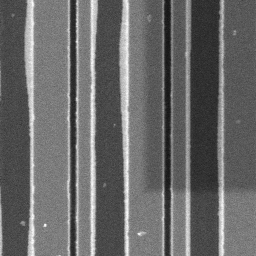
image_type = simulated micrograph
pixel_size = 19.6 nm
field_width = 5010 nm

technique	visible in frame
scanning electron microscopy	lines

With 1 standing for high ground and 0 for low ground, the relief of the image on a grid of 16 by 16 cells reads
0011110011110011
0011110011110011
0011110011110011
0011110011110011
0011110011110011
0011110011110011
0011110011110011
0011110011110011
0011110011110011
0011110011110011
0011110011110011
0011110011110011
0011110011110011
0011110011110011
0011110011110011
0011110011110011